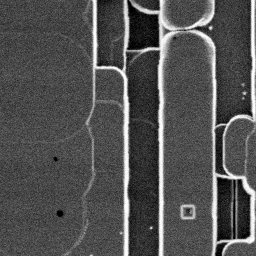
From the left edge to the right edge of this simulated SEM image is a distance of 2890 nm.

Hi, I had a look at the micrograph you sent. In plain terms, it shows wiring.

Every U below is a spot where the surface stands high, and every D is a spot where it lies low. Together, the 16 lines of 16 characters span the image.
UUUUUUDDDDUUUDDD
UUUUUUDDDDUUUDDD
UUUUUUDDDDUUUDDD
UUUUUUDDDDUUUDDD
UUUUUUUUDDUUUDDD
UUUUUUUUDDUUUDDD
UUUUUUUUDDUUUDDD
UUUUUUUUDDUUUUUU
UUUUUUUUDDUUUUUU
UUUUUUUUDDUUUUUU
UUUUUUUUDDUUUUUU
UUUUUUUUDDUUUDDU
UUUUUUUUDDUUUDDD
UUUUUUUUDDUUUDDD
UUUUUUUUDDUUUDDD
UUUUUUUUDDUUUDUU